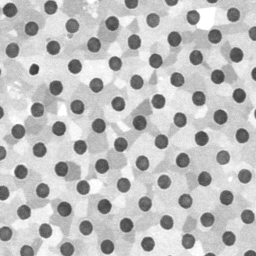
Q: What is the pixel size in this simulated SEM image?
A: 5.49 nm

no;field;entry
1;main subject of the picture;a regular array of holes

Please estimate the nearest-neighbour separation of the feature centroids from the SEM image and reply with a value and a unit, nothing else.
156 nm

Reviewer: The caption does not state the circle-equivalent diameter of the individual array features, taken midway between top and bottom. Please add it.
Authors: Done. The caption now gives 84.1 nanometers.